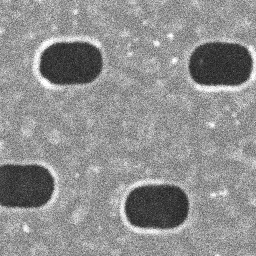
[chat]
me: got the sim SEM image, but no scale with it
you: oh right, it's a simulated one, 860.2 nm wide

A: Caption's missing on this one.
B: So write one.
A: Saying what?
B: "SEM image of holes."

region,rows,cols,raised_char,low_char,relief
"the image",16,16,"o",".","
oooooooooooooooo
oooooooooooooooo
oooooooooooooooo
ooo...oooooo....
ooo...oooooo....
oooooooooooooooo
oooooooooooooooo
oooooooooooooooo
oooooooooooooooo
oooooooooooooooo
...ooooooooooooo
...ooooooooooooo
...ooooo....oooo
oooooooo....oooo
oooooooooooooooo
oooooooooooooooo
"